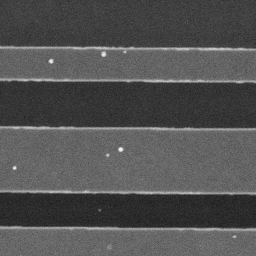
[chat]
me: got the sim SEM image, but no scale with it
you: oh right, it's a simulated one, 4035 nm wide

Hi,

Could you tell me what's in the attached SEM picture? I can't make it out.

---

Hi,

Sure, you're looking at lines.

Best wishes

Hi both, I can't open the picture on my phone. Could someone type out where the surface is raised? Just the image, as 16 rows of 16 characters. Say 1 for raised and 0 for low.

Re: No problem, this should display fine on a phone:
0000000000000000
0000000000000000
0000000000000000
1111111111111111
1111111111111111
0000000000000000
0000000000000000
0000000000000000
1111111111111111
1111111111111111
1111111111111111
1111111111111111
0000000000000000
0000000000000000
1111111111111111
1111111111111111